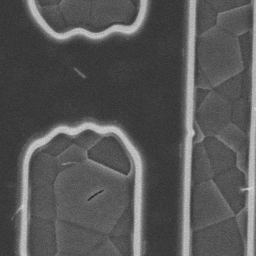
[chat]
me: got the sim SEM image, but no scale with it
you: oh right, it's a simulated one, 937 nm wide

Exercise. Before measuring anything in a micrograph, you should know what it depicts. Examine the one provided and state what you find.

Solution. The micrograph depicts one or a few lines or trenches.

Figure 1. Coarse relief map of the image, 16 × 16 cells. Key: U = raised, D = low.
UUDDDDDDDUUUDDDD
UUUDDDDDUUUUDDDD
UUUUUUUUUUUUDDDD
UUUUUUUUUUUUDDDD
UUUUUUUUUUUUDDDD
UUUUUUUUUUUUDDDD
UUUUUUUUUUUUDDDD
UUUUUUUUUUUUDDDD
UUUDDDDDUUUUDDDD
UUDDDDDDUUUUDDDD
UUDDDDDDDUUUDDDD
UUDDDDDDDUUUDDDD
UUDDDDDDDUUUDDDD
UUDDDDDDDUUUDDDD
UDDDDDDDDUUUDDDD
UDDDDDDDDUUUDDDD